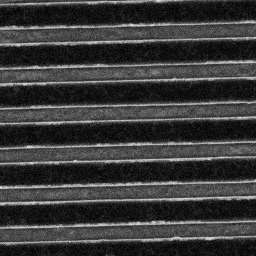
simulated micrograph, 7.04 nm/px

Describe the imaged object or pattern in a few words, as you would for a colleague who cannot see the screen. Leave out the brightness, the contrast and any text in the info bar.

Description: parallel lines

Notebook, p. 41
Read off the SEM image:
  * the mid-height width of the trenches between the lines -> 102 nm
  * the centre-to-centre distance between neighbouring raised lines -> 280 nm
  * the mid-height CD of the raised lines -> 178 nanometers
